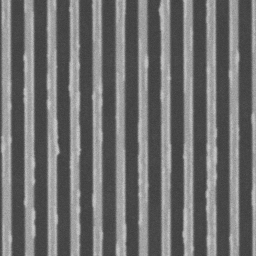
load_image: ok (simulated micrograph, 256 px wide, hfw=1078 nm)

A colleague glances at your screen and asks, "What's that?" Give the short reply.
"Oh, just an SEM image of parallel lines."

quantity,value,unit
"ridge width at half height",43.1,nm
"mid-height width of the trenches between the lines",51.5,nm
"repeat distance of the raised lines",95.7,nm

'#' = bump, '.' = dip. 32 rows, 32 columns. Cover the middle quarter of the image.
.###...##....##....##...###...##
.###...##....##....##...###...##
.###...##....##....##...###...##
.###...##....##....##...###...##
..##...##....##....##...###...##
.###...##....##....##...###...##
.###...##....##....##...###...##
..##...##....##....##...###...##
..##...##....##....##...###...##
..##...##....##....##...###...##
..##...##....##....##...###...##
..##...##....##....##...###...##
..##...##....##....##...###...##
..##...##....##....##...###...##
..##...##....##....##...###...##
..##...##....##....##...###...##
..##...##....##....##...###...##
..##...##....##....##...###...##
..##...##....##....##...###...##
..##...###...##....##...###...##
..##...###...##....##...###...##
..##...###...##....##...###...##
..##...###...##....##...###...##
..##...###...##....##...###...##
..##...###...##....##...###...##
..##...###...##....##...###...##
..##...###...##....##...###...##
..##...###...##....##...###...##
..##...###...##....##...###...##
..##...###...##....##...###...##
..##...###...##....##...###...##
..##...###...##....##...###...##